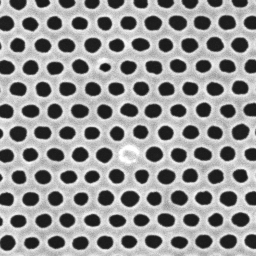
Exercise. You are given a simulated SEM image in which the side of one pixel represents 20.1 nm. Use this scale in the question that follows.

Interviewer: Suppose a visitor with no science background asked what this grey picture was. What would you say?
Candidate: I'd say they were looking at a regular array of holes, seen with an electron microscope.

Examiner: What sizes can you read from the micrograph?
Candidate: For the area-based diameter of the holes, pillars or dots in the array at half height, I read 0.319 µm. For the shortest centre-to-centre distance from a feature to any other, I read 486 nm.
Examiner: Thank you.